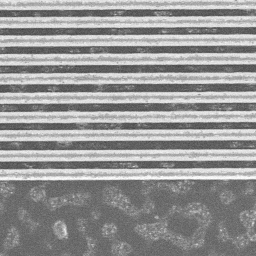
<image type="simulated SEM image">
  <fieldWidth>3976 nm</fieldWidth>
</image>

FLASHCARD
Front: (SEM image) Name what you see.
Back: parallel lines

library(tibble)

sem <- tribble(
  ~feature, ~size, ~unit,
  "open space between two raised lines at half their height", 173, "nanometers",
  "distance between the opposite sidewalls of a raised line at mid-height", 114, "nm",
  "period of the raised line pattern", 0.295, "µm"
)